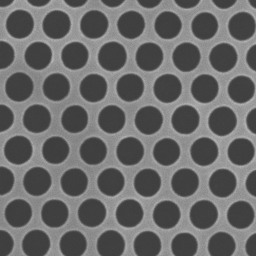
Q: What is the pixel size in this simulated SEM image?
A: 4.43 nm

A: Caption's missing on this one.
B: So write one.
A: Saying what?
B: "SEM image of a regular array of holes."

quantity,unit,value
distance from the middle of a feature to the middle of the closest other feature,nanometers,160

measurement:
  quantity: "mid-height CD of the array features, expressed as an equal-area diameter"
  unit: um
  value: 0.124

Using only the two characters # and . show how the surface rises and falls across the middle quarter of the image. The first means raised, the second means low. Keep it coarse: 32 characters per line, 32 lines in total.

.....####......####.....####....
###########..#######...######...
################..#######..#####
.####.....####.....#####.....###
.###.......##.......###......###
..##.......##.......##........##
.###.......##.......##........##
.###......###.......###......###
#####.....####.....####.....####
#######.################...#####
##..#######..########.#######...
.....#####.....####.....####....
......###......###......###.....
......##.......###.......##.....
......##.......###.......##.....
......###......###......###.....
#....#####....#####.....####....
###########.########..#######..#
######..#######...##############
.####.....####.....####.....####
.###.......##.......###......###
.###.......##.......##.......###
.###.......##.......##.......###
.###......###.......###......###
#####....#####.....####.....####
#########################.######
#...######...#######...######...
.....####......###......####....
......###......###......###.....
......##.......###......###.....
......###......###......###.....
.....####.....####......###.....